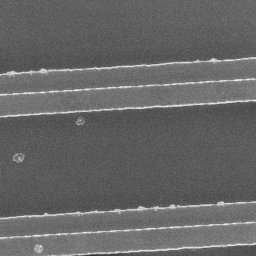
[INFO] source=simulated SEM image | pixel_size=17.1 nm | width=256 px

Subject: lines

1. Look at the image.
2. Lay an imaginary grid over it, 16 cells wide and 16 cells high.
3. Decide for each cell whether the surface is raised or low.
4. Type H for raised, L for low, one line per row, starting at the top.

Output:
LLLLLLLLLLLLLLLL
LLLLLLLLLLLLLLLL
LLLLLLLLLLLLLLLL
LLLLLLLLLLLLLLLL
LLHHHHHHHHHHHHHH
HHHHHHHHHHHHHHHH
HHHHHHHHHHHHHLLL
LLLLLLLLLLLLLLLL
LLLLLLLLLLLLLLLL
LLLLLLLLLLLLLLLL
LLLLLLLLLLLLLLLL
LLLLLLLLLLLLLLLL
LLLLLLLLLLLLLLLL
LLHHHHHHHHHHHHHH
HHHHHHHHHHHHHHHH
HHHHHHHHHHHLLLLL